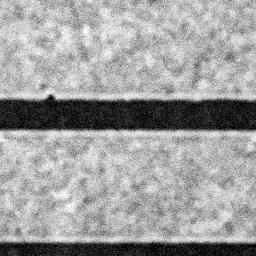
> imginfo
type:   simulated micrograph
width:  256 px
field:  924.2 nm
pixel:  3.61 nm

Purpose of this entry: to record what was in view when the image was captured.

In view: one or a few lines or trenches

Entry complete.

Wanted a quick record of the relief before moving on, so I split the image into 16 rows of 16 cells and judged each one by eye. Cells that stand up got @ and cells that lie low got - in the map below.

@@@@@@@@@@@@@@@@
@@@@@@@@@@@@@@@@
@@@@@@@@@@@@@@@@
@@@@@@@@@@@@@@@@
@@@@@@@@@@@@@@@@
@@@@@@@@@@@@@@@@
----------------
----------------
@@@@@@@@@@@@@@@@
@@@@@@@@@@@@@@@@
@@@@@@@@@@@@@@@@
@@@@@@@@@@@@@@@@
@@@@@@@@@@@@@@@@
@@@@@@@@@@@@@@@@
@@@@@@@@@@@@@@@@
----------------